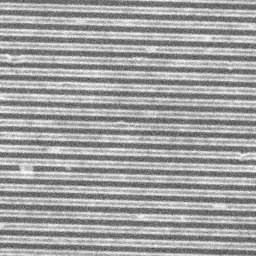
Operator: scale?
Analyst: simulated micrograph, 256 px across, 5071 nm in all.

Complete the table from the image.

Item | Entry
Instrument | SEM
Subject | parallel lines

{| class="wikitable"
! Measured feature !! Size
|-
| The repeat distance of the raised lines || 256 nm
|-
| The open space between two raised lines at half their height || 0.146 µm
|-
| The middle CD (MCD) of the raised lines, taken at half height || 109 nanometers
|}